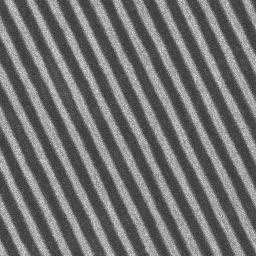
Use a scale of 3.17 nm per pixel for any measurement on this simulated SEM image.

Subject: parallel lines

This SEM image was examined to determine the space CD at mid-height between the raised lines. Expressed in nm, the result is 39.6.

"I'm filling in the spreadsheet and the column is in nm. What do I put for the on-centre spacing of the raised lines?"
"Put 61.5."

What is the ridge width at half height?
7.07 pixels